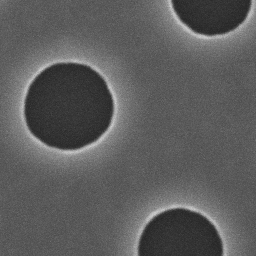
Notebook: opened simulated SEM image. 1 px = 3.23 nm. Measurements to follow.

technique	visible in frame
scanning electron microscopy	holes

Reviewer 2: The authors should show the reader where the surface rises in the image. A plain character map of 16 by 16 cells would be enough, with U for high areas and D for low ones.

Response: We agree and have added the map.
UUUUUUUUUUUDDDDD
UUUUUUUUUUUDDDDU
UUUUUUUUUUUUUUUU
UUUUUUUUUUUUUUUU
UUUDDDUUUUUUUUUU
UUDDDDDUUUUUUUUU
UUDDDDDUUUUUUUUU
UUDDDDDUUUUUUUUU
UUDDDDUUUUUUUUUU
UUUUUUUUUUUUUUUU
UUUUUUUUUUUUUUUU
UUUUUUUUUUUUUUUU
UUUUUUUUUUUUUUUU
UUUUUUUUUUDDDUUU
UUUUUUUUUDDDDDUU
UUUUUUUUUDDDDDUU